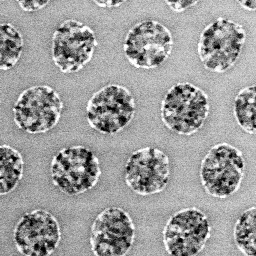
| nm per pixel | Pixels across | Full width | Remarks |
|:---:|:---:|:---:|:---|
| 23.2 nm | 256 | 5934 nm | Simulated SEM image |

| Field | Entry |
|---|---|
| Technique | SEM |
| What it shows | a regular array of raised bodies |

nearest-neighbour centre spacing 1.68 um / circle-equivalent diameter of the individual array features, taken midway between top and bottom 1.07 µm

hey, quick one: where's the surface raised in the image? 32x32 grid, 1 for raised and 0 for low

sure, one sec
00011100000001100000011100000011
00000000000000000000000000000000
00000000000000000000000000010000
11000001111000000111100000111100
11100001111100001111100001111110
11100001111100001111100001111100
11100001111000001111100001111100
11000001111000001111000001111000
00000000110000000000000000110000
00000000000000000000000000000000
00000000000000000000000000000000
00011110000011110000011110000011
00111110000111110000011111000011
00111111000111111000111111000111
00111110000111110000111111000011
00111110000111110000011110000011
00000000000001000000001100000001
00000000000000000000000000000000
10000000010000000000000000011000
11000001111100000111100000111100
11100001111100001111100001111100
11100001111100001111100001111100
11000001111100001111100001111100
11000000111000000111000000111100
00000000000000000000000000000000
00000000000000000000000000000000
00001100000001100000000110000001
00011110000011110000011111000011
00111110000011111000011111000111
00111110000111111000011111000111
00111110000011110000011111000011
00011100000011110000011110000011